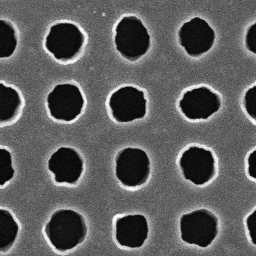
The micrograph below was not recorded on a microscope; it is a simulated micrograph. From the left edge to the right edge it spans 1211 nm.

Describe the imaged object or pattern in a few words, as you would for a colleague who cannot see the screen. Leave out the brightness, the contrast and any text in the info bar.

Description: a regular array of holes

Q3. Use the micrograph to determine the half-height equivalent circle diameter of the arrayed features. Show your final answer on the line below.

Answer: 0.169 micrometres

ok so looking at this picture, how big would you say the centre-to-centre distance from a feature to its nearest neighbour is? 298 nanometers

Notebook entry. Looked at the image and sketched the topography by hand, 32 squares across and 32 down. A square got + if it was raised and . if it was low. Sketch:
++++++++++++++++++++++++++++++++
++++++++++++++++++++++++++++++++
+++++++++++++++..+++++++.+++++++
.+++++....+++++...+++++...+++++.
..++++....++++.....++++....++++.
..++++....++++.....++++....++++.
..++++....+++++...+++++...++++++
++++++++++++++++++++++++++++++++
++++++++++++++++++++++++++++++++
++++++++++++++++++++++++++++++++
++++++++++++++++++++++++++++++++
..++++....++++....+++++...+++++.
..++++....++++....+++++....++++.
..++++....++++....+++++....++++.
.++++++...++++....+++++...+++++.
++++++++++++++++++++++++++++++++
++++++++++++++++++++++++++++++++
++++++++++++++++++++++++++++++++
++++++++++++++++++++++++.+++++++
.+++++....+++++...+++++....++++.
.+++++....+++++....++++....++++.
..+++++...+++++....++++....++++.
.++++++..++++++...++++++..++++++
++++++++++++++++++++++++++++++++
++++++++++++++++++++++++++++++++
++++++++++++++++++++++++++++++++
.++++++..+++++++++++++++..++++++
..++++....+++++...+++++....++++.
..++++.....+++....+++++....++++.
..++++.....++++...+++++....++++.
.++++++...+++++...++++++..++++++
++++++++++++++++++++++++++++++++